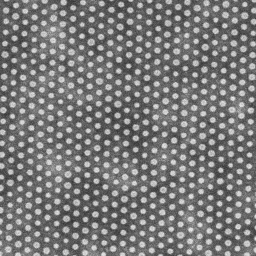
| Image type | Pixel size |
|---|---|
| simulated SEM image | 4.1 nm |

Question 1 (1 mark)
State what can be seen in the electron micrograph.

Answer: a regular array of raised bodies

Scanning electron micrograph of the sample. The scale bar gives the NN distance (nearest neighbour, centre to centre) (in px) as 10.7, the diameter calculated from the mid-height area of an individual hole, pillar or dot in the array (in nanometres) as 22.2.